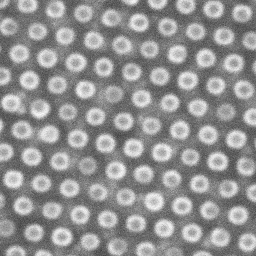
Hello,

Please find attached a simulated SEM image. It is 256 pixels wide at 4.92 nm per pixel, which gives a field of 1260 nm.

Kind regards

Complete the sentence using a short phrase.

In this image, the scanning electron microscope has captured a regular array of raised bodies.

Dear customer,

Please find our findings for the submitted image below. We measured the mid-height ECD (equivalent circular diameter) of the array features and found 82.7 nanometers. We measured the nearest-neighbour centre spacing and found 139 nanometers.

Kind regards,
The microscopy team